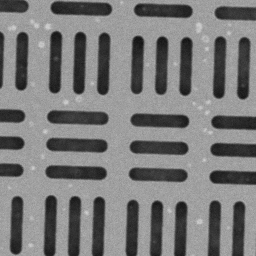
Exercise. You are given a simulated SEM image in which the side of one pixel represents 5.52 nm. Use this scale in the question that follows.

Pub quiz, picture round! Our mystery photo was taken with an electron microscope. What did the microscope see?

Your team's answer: groups of lines, slits or small figures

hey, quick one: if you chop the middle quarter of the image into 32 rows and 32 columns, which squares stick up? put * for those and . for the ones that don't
**....**....*****...***...***...
**....**....*****...***...***...
**...***....*****...***...***...
**...***....*****...***...***...
**...***...******...***...***...
**...***...******...***...***...
**...***...******...***...***...
***.*****..******..****..****...
********************************
********************************
********************************
....****************************
...........*******.........*****
...........******..............*
...........******...............
******************.............*
********************************
********************************
..******************************
...........******.............**
...........*****...............*
...........******..............*
*******************...........**
********************************
********************************
.......*************************
...........*****..............**
...........*****...............*
..........******...............*
********************..........**
********************************
********************************